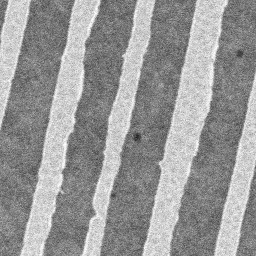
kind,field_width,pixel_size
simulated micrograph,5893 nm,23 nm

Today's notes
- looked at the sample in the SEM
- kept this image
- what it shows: one or a few lines or trenches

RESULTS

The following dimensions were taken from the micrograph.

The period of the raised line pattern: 1430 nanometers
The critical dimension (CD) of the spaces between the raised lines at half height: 0.987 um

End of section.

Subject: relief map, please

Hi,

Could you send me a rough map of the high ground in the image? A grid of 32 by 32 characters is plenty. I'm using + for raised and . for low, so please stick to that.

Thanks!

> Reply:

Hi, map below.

.+++.....+++.....++......+++....
.++......+++.....++.....++++....
.++......+++.....++.....++++....
+++......++......++.....+++.....
+++......++......++.....+++.....
+++.....++......++......+++.....
++......++......++.....++++.....
++......++......++.....++++.....
++......++.....+++.....+++......
+......+++.....++......+++......
+......+++.....++......+++......
+......+++.....++.....++++......
+......+++.....++.....++++.....+
+......++.....++......++++.....+
......+++.....++......++++.....+
......+++.....++......+++......+
......+++.....++.....++++.....++
......++.....++......++++.....++
......++.....++......++++.....++
.....+++.....++......+++......++
.....+++.....++.....++++......++
.....+++.....++.....++++.....+++
.....+++....++......+++......++.
.....++.....++......+++......++.
....+++.....++......+++......++.
....+++.....+......++++.....+++.
....+++.....+......+++......++..
....++......+......+++......++..
...+++.....++......+++......++..
...+++.....++......++......+++..
...++......++.....+++......+++..
...++......+......+++......++...